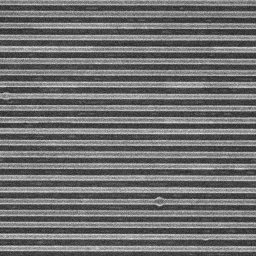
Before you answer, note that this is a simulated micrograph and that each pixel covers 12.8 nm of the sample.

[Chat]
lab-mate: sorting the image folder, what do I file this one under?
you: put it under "parallel lines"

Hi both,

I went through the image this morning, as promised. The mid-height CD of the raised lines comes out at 59.2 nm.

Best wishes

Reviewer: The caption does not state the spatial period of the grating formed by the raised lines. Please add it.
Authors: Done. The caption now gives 150 nm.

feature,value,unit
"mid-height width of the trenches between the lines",83.2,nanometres